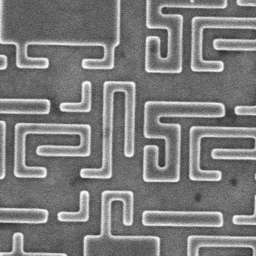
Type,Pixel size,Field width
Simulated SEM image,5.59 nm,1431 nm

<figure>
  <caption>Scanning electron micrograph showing wiring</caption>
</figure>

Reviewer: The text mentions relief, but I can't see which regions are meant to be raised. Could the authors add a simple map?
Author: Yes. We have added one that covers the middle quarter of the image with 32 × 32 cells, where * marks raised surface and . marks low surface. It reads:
.....*******.........********...
.....................********...
................................
................................
................................
.....**...********..............
.....**...********..............
.....**...**...***..............
.....**...**...***..............
....***...**...***...*****......
*******...**...***..************
******....**...***..************
..........**...**...************
..........**...**...****........
..........**...**...****........
******....**...**...*********...
******....**...**...*********...
...***....**...**...*********...
....**....**...**........****...
....**....**...**........****...
...***....**...**...***..****...
******....**...**...***..****...
******....**...**...***..****...
..........**........***..****...
..........**........***..****...
..........**........****.****...
....********........*********...
....********........*********...
....................*********...
................................
................................
................................